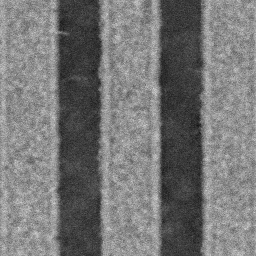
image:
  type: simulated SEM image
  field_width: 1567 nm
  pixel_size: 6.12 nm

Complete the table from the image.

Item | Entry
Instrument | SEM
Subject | one or a few lines or trenches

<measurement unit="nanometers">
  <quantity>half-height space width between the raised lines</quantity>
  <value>331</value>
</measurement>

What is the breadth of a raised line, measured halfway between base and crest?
302 nanometers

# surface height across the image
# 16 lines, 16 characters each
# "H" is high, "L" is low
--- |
HHHLLLLHHHLLLHHH
HHHLLLLHHHLLLHHH
HHHLLLLHHHLLLHHH
HHHLLLLHHHLLLHHH
HHHLLLLHHHLLLHHH
HHHLLLLHHHLLLHHH
HHHLLLLHHHLLLHHH
HHHLLLLHHHLLLHHH
HHHLLLLHHHLLLHHH
HHHLLLLHHHLLLHHH
HHHLLLLHHHLLLHHH
HHHLLLLHHHLLLHHH
HHHLLLLHHHLLLHHH
HHHLLLLHHHLLLHHH
HHHLLLLHHHLLLHHH
HHHLLLLHHHLLLHHH